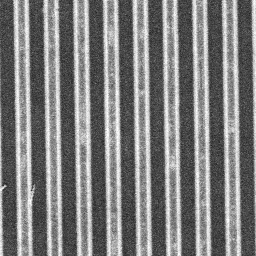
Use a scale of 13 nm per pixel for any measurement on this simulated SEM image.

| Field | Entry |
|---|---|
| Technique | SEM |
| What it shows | parallel lines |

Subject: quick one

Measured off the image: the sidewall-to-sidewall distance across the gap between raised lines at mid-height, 229 nanometres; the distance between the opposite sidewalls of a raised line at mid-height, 153 nanometers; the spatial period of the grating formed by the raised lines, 29.7 px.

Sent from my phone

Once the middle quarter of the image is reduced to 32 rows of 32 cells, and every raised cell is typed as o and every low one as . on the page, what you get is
...ooo.....oo.....ooo....ooo....
...ooo.....oo.....ooo....ooo....
...ooo.....oo.....ooo....ooo....
...ooo.....oo.....ooo....ooo....
...ooo.....oo.....ooo....ooo....
...ooo.....oo.....ooo....ooo....
...ooo.....oo.....ooo....ooo....
...ooo.....oo.....ooo....ooo....
...ooo.....oo.....ooo....ooo....
...ooo.....oo.....ooo....ooo....
...ooo.....oo.....ooo....ooo....
...ooo.....oo.....ooo....ooo....
...ooo.....oo.....ooo....ooo....
...ooo.....oo.....ooo....ooo....
...ooo.....oo.....ooo....ooo....
...ooo.....oo.....ooo....ooo....
...ooo.....oo.....ooo.....oo....
...ooo.....ooo....ooo.....oo....
...ooo.....ooo....ooo.....oo....
...ooo.....ooo....ooo.....oo....
...ooo.....ooo....ooo.....ooo...
...ooo.....ooo....ooo.....ooo...
...ooo.....ooo....ooo.....ooo...
...ooo.....ooo....ooo.....ooo...
...ooo.....ooo....ooo.....ooo...
....oo.....ooo....ooo.....ooo...
....oo.....ooo....ooo.....ooo...
....oo.....ooo....ooo.....oo....
....oo.....ooo....ooo.....ooo...
....oo.....ooo....ooo.....ooo...
....oo.....ooo....ooo.....ooo...
....oo.....ooo....ooo.....ooo...